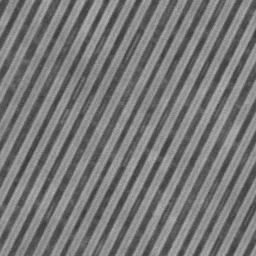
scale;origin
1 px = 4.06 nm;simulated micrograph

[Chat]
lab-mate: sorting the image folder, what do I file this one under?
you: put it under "parallel lines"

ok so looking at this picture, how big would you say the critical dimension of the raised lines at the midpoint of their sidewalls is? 27.2 nm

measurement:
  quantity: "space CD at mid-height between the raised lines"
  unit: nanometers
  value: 31.3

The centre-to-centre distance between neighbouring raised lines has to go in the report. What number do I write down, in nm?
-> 60.7